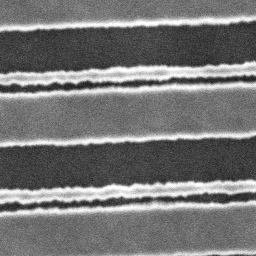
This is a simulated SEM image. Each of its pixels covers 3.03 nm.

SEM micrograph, lines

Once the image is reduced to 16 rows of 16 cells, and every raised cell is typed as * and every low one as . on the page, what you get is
****************
*********.......
................
................
.....***********
****************
****************
****************
****************
................
................
...........*****
****************
****************
****************
****************